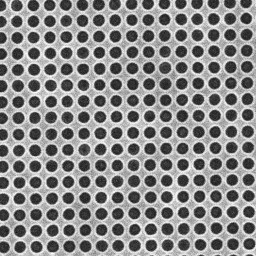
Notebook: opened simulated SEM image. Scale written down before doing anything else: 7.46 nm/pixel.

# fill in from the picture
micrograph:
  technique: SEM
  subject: a regular array of holes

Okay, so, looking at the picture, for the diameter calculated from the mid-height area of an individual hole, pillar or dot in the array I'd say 12.4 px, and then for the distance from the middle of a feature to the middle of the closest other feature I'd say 119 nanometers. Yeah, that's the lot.